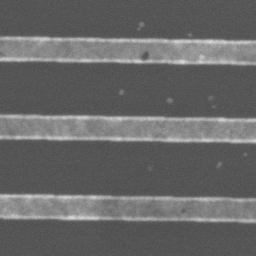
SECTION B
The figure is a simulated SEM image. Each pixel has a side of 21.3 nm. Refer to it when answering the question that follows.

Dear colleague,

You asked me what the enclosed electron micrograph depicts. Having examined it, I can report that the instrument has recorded lines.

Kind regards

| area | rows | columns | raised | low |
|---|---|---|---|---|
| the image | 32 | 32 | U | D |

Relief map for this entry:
DDDDDDDDDDDDDDDDDDDDDDDDDDDDDDDD
DDDDDDDDDDDDDDDDDDDDDDDDDDDDDDDD
DDDDDDDDDDDDDDDDDDDDDDDDDDDDDDDD
DDDDDDDDDDDDDDDDDDDDDDDDDDDDDDDD
DDDDDDDDDDDDDDDDDDDDDDDDDDDDDDDD
UUUUUUUUUUUUUUUUUUUUUUUUUUUUUUUU
UUUUUUUUUUUUUUUUUUUUUUUUUUUUUUUU
DDDUUUUUUUUUUUUUUUUUUUUUUUUUUUUU
DDDDDDDDDDDDDDDDDDDDDDDDDDDDDDDD
DDDDDDDDDDDDDDDDDDDDDDDDDDDDDDDD
DDDDDDDDDDDDDDDDDDDDDDDDDDDDDDDD
DDDDDDDDDDDDDDDDDDDDDDDDDDDDDDDD
DDDDDDDDDDDDDDDDDDDDDDDDDDDDDDDD
DDDDDDDDDDDDDDDDDDDDDDDDDDDDDDDD
UDDDDDDDDDDDDDDDDDDDDDDDDDDDDDDD
UUUUUUUUUUUUUUUUUUUUUUUUUUUUUUUU
UUUUUUUUUUUUUUUUUUUUUUUUUUUUUUUU
DDDDDDDDDDDDDDDDUUUUUUUUUUUUUUUU
DDDDDDDDDDDDDDDDDDDDDDDDDDDDDDDD
DDDDDDDDDDDDDDDDDDDDDDDDDDDDDDDD
DDDDDDDDDDDDDDDDDDDDDDDDDDDDDDDD
DDDDDDDDDDDDDDDDDDDDDDDDDDDDDDDD
DDDDDDDDDDDDDDDDDDDDDDDDDDDDDDDD
DDDDDDDDDDDDDDDDDDDDDDDDDDDDDDDD
UUUDDDDDDDDDDDDDDDDDDDDDDDDDDDDD
UUUUUUUUUUUUUUUUUUUUUUUUUUUUUUUU
UUUUUUUUUUUUUUUUUUUUUUUUUUUUUUUU
DDDDDDDDDDDDDDDDDDDUUUUUUUUUUUUU
DDDDDDDDDDDDDDDDDDDDDDDDDDDDDDDD
DDDDDDDDDDDDDDDDDDDDDDDDDDDDDDDD
DDDDDDDDDDDDDDDDDDDDDDDDDDDDDDDD
DDDDDDDDDDDDDDDDDDDDDDDDDDDDDDDD